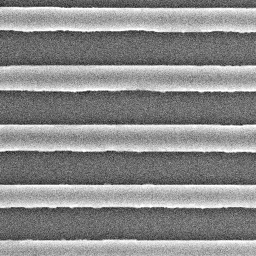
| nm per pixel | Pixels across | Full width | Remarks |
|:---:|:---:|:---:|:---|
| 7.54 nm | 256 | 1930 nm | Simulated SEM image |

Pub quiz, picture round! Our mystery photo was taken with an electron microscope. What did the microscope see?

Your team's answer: lines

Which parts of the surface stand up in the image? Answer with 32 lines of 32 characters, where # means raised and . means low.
................................
################################
################################
################################
................................
................................
................................
................................
################################
################################
################################
................................
................................
................................
................................
................................
################################
################################
################################
................................
................................
................................
................................
################################
################################
################################
................................
................................
................................
................................
################################
################################